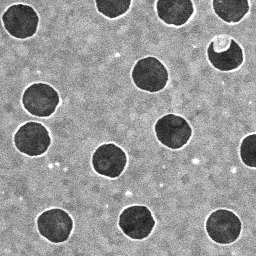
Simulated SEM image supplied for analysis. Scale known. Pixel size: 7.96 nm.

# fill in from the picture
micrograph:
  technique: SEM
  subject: a regular array of holes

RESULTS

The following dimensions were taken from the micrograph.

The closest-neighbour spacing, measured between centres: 67.6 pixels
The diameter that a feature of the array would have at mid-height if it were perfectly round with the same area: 0.281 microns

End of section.